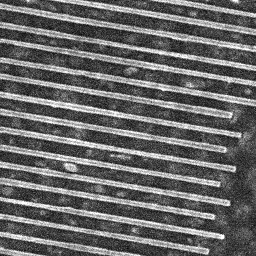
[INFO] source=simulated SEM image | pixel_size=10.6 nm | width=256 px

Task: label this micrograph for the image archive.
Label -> parallel lines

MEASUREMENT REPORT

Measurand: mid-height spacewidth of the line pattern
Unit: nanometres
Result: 142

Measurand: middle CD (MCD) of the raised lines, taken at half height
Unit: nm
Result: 40.7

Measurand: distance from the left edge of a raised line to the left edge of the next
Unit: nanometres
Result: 184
